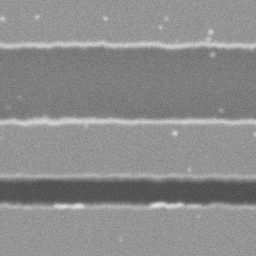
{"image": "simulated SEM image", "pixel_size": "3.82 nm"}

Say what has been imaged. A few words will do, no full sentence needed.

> lines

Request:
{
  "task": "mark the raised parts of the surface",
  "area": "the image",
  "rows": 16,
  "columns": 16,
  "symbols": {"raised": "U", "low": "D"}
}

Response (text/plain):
UUUUUUUUUUUUUUUU
UUUUUUUUUUUUUUUU
UUUUUUUUUUUUUUUU
DDDDDDDDDDDDDDDD
DDDDDDDDDDDDDDDD
DDDDDDDDDDDDDDDD
DDDDDDDDDDDDDDDD
DDDDDDDDDDDDDDDD
UUUUUUUUUUUUUUUU
UUUUUUUUUUUUUUUU
UUUUUUUUUUUUUUUU
DDDDDDDDDDDDDDDD
DDDDDDDDDDDDDDDD
UUUUUUUUUUUUUUUU
UUUUUUUUUUUUUUUU
UUUUUUUUUUUUUUUU